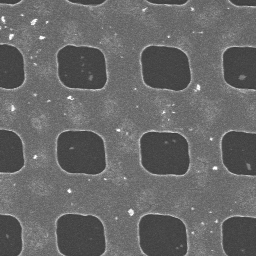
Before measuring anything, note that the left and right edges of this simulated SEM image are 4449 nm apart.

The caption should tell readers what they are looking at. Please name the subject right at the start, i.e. holes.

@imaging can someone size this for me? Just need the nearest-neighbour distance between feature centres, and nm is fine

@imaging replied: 1450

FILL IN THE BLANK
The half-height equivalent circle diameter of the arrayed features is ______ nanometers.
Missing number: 854